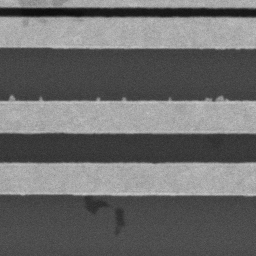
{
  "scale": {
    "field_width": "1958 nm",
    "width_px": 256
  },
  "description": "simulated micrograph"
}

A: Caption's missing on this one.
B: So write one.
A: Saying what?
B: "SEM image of lines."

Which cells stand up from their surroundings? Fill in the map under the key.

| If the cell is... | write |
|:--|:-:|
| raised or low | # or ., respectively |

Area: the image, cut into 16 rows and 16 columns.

................
################
################
................
................
................
################
################
................
................
################
################
................
................
................
................